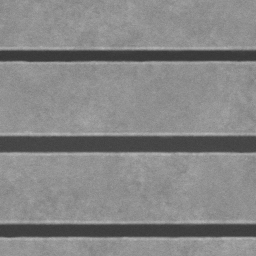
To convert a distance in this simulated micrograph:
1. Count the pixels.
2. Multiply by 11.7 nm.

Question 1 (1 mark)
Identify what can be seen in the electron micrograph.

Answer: lines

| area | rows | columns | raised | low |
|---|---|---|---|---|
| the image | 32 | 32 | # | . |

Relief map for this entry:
################################
################################
################################
################################
################################
################################
................................
................................
################################
################################
################################
################################
################################
################################
################################
################################
################################
................................
................................
################################
################################
################################
################################
################################
################################
################################
################################
################################
................................
................................
################################
################################